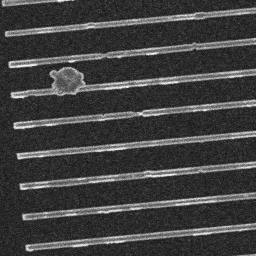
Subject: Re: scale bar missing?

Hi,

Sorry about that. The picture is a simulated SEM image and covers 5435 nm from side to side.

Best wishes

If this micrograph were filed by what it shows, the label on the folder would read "parallel lines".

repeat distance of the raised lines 652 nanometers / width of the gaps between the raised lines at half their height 534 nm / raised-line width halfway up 114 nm